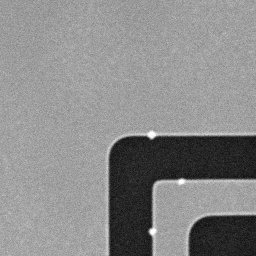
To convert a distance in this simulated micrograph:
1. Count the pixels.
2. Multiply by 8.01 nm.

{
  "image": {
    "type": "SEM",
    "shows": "groups of lines, slits or small figures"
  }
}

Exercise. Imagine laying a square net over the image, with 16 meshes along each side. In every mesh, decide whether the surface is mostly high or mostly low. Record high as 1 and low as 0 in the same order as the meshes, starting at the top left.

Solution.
1111111111111111
1111111111111111
1111111111111111
1111111111111111
1111111111111111
1111111111111111
1111111111111111
1111111111111111
1111111101000000
1111111000000000
1111111000000000
1111111000111111
1111111000111111
1111111000111000
1111111001110000
1111111000110000